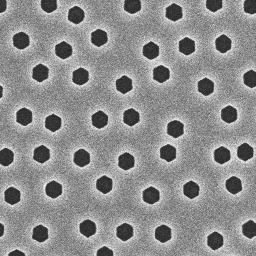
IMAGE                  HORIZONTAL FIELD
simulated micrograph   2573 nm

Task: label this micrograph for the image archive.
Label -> a regular array of holes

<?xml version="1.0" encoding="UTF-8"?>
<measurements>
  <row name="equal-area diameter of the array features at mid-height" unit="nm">174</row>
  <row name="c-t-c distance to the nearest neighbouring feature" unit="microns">0.331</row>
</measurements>